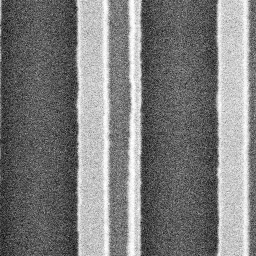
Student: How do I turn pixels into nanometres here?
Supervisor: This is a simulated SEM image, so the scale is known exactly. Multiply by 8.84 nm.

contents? lines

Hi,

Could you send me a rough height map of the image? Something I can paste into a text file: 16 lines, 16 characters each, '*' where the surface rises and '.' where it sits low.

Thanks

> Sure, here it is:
.....****.....**
.....****.....**
.....****.....**
.....****.....**
.....****.....**
.....****.....**
.....****.....**
.....****.....**
.....****.....**
.....****.....**
.....****.....**
.....****.....**
.....****.....**
.....****.....**
.....****.....**
.....****.....**